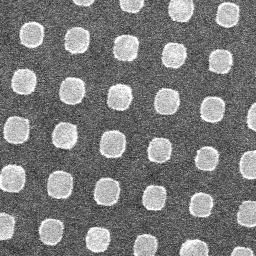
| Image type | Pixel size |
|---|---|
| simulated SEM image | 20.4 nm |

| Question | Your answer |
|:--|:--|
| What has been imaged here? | a regular array of raised bodies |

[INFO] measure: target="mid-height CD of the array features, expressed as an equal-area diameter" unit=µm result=0.505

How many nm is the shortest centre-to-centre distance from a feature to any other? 966